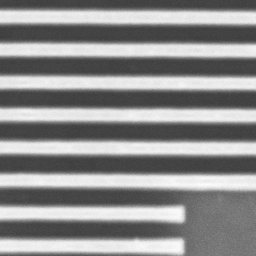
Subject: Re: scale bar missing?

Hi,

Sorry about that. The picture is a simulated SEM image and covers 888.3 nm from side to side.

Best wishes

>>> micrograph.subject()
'parallel lines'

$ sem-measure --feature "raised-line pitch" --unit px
32.7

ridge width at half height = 45.6 nanometres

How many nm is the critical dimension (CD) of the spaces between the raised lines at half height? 67.7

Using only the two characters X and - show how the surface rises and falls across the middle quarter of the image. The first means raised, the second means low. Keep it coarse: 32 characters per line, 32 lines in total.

--------------------------------
--------------------------------
--------------------------------
XXXXXXXXXXXXXXXXXXXXXXXXXXXXXXXX
XXXXXXXXXXXXXXXXXXXXXXXXXXXXXXXX
XXXXXXXXXXXXXXXXXXXXXXXXXXXXXXXX
--------------------------------
--------------------------------
--------------------------------
--------------------------------
--------------------------------
XXXXXXXXXXXXXXXXXXXXXXXXXXXXXXXX
XXXXXXXXXXXXXXXXXXXXXXXXXXXXXXXX
XXXXXXXXXXXXXXXXXXXXXXXXXXXXXXXX
------------------------------XX
--------------------------------
--------------------------------
--------------------------------
--------------------------------
XXXXX-----XXXX------------------
XXXXXXXXXXXXXXXXXXXXXXXXXXXXXXXX
XXXXXXXXXXXXXXXXXXXXXXXXXXXXXXXX
-XXXXXXXXXXXXXXXXXXXXXXXXXXXXXXX
--------------------------------
--------------------------------
--------------------------------
--------------------------------
--------------------------------
XXXXXXXXXXXXXXXXXXXXXXXXXXXXXXXX
XXXXXXXXXXXXXXXXXXXXXXXXXXXXXXXX
XXXXXXXXXXXXXXXXXXXXXXXXXXXXXXXX
--------------------------------